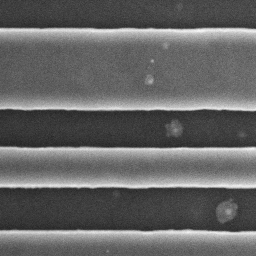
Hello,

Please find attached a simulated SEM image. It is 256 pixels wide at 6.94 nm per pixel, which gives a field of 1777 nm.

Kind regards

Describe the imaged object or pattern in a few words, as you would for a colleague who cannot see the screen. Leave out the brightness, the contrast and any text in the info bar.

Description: lines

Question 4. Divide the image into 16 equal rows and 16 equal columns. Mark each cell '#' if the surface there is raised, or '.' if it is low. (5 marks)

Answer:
................
................
################
################
################
################
################
................
................
################
################
################
................
................
##############..
################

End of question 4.